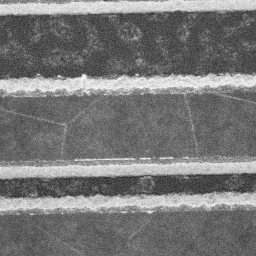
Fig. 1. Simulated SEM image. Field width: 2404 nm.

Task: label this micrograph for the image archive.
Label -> one or a few lines or trenches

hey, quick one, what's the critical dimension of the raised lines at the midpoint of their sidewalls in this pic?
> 787 nanometres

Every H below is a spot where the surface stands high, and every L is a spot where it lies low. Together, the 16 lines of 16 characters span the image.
HLLLLLLLLLLLLLLL
LLLLLLLLLLLLLLLL
LLLLLLLLLLLLLLLL
LLLLLLLLLLLLLLLL
LLLLLLLLLLLLLLLL
HHHHHHHHHHHHHHHH
HHHHHHHHHHHHHHHH
HHHHHHHHHHHHHHHH
HHHHHHHHHHHHHHHH
HHHHHHHHHHHHHHHH
HHHHHHHHHLLLLLLL
LLLLLLLLLLLLLLLL
LLLLLLLLLLLLLLLL
HHHHHHHHHHHHHHHH
HHHHHHHHHHHHHHHH
HHHHHHHHHHHHHHHH